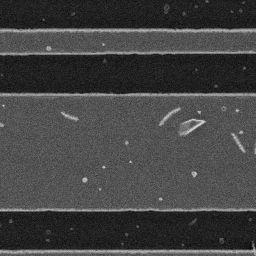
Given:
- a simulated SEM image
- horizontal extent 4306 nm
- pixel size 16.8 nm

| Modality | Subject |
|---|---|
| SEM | lines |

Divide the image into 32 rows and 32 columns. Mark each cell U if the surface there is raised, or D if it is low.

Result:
DDDDDDDDDDDDDDDDDDDDDDDDDDDDDDDD
DDDDDDDDDDDDDDDDDDDDDDDDDDDDDDDD
DDDDDDDDDDDDDDDDDDDDDDDDDDDDDDDD
DDDDDDDDDDDDDDDDDDDDDDDDDDDDDDDD
UUUUUUUUUUUUUUUUUUUUUUUUUUUUUUUU
UUUUUUUUUUUUUUUUUUUUUUUUUUUUUUUU
UUUUUUUUUUUUUUUUUUUUUUUUUUUUUUUU
DDDDDDDDDDDDDDDDDDDDDDDDDDDDDDDD
DDDDDDDDDDDDDDDDDDDDDDDDDDDDDDDD
DDDDDDDDDDDDDDDDDDDDDDDDDDDDDDDD
DDDDDDDDDDDDDDDDDDDDDDDDDDDDDDDD
DDDDDDDDDDDDDDDDDDDDDDDDDDDDDDDD
UUUUUUUUUUUUUUUUUUUUUUUUUUUUUUUU
UUUUUUUUUUUUUUUUUUUUUUUUUUUUUUUU
UUUUUUUUUUUUUUUUUUUUUUUUUUUUUUUU
UUUUUUUUUUUUUUUUUUUUUUUUUUUUUUUU
UUUUUUUUUUUUUUUUUUUUUUUUUUUUUUUU
UUUUUUUUUUUUUUUUUUUUUUUUUUUUUUUU
UUUUUUUUUUUUUUUUUUUUUUUUUUUUUUUU
UUUUUUUUUUUUUUUUUUUUUUUUUUUUUUUU
UUUUUUUUUUUUUUUUUUUUUUUUUUUUUUUU
UUUUUUUUUUUUUUUUUUUUUUUUUUUUUUUU
UUUUUUUUUUUUUUUUUUUUUUUUUUUUUUUU
UUUUUUUUUUUUUUUUUUUUUUUUUUUUUUUU
UUUUUUUUUUUUUUUUUUUUUUUUUUUUUUUU
UUUUUUUUUUUUUUUUUUUUUUUUUUUUUUUU
DDDDDDDDDDDDDDDDDDDDDDDDDDDDDDDD
DDDDDDDDDDDDDDDDDDDDDDDDDDDDDDDD
DDDDDDDDDDDDDDDDDDDDDDDDDDDDDDDD
DDDDDDDDDDDDDDDDDDDDDDDDDDDDDDDD
DDDDDDDDDDDDDDDDDDDDDDDDDDDDDDDD
UUUUUUUUUUUUUUUUUUUUUUUUUUUUUUUU